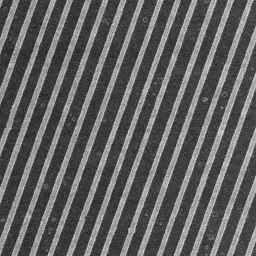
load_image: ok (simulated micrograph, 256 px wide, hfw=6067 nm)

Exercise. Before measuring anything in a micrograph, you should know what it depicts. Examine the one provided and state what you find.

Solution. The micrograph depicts parallel lines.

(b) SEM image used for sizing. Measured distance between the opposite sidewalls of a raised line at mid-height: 112 nanometres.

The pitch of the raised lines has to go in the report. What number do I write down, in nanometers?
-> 399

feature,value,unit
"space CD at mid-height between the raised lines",282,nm